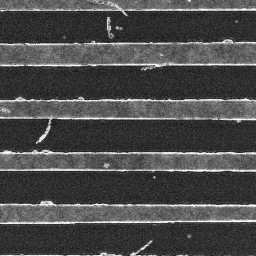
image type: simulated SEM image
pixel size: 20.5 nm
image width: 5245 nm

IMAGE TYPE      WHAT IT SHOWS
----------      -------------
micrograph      lines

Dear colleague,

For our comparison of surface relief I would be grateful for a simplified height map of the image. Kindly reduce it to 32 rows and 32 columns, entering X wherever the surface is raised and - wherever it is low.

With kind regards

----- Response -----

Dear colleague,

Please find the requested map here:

XXXXXXXXXXXXXXXXXXXXXXXXXXXXXXXX
--------------------------------
--------------------------------
--------------------------------
--------------------------------
---------X-XXXXXXXXXXXXXXXXXXXXX
XXXXXXXXXXXXXXXXXXXXXXXXXXXXXXXX
XXXXXXXXXXXXXXXXXXXXXXXXXXXXXXXX
--------------------------------
--------------------------------
--------------------------------
--------------------------------
--X-X-XX-XX-XXXXXXX--X-XXXXXXXXX
XXXXXXXXXXXXXXXXXXXXXXXXXXXXXXXX
XXXXXXXXXXXXXXXXXXXXXXXXXXXXXXXX
--------------------------------
--------------------------------
--------------------------------
--------------------------------
XXXXXXXXXXXXXXXXXXXXXXXXXXXXXXXX
XXXXXXXXXXXXXXXXXXXXXXXXXXXXXXXX
--------------------------------
--------------------------------
--------------------------------
--------------------------------
--------------------------------
XXXXXXXXXXXXXXXXXXXXXXXXXXXXXXXX
XXXXXXXXXXXXXXXXXXXXXXXXXXXXXXXX
--------------------------------
--------------------------------
--------------------------------
--------------------------------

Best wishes